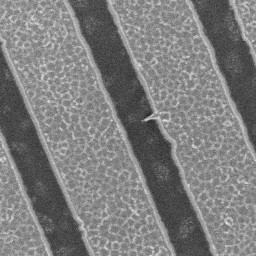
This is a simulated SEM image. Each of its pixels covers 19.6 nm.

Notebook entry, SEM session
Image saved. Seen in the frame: one or a few lines or trenches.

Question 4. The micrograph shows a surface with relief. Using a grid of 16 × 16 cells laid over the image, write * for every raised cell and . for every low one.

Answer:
****...*****...*
*****..*****...*
*****...*****..*
******..*****...
.*****...*****..
.*****...*****..
..*****...*****.
..*****...*****.
...*****..*****.
...*****...*****
*..******..*****
*...*****...****
**..*****...****
**...*****..****
***..*****...***
***...*****..***